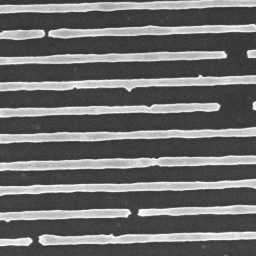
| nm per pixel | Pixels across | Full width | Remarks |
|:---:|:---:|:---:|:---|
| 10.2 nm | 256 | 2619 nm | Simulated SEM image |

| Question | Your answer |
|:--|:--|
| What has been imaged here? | parallel lines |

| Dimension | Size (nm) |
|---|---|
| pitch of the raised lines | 264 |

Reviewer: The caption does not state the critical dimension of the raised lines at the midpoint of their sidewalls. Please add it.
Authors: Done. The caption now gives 0.0767 um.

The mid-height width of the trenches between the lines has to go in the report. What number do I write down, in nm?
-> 190